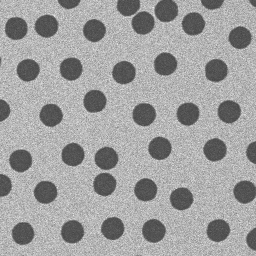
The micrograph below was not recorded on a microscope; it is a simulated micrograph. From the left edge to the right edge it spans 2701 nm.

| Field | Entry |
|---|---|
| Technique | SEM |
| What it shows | a regular array of holes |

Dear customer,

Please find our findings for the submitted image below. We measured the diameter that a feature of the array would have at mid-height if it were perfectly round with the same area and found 23.1 pixels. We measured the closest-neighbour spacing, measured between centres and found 425 nm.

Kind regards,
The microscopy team